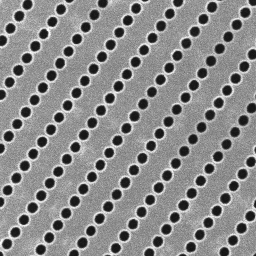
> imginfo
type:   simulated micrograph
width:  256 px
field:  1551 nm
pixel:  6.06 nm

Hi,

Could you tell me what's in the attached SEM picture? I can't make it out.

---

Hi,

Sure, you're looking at a regular array of holes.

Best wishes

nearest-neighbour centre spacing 89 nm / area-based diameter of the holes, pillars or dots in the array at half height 60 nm